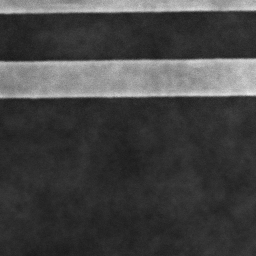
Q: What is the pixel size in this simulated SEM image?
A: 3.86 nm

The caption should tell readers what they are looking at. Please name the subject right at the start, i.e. wiring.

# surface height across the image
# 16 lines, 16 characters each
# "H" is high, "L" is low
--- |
HHHHHHHHHHHHHHHH
LLLLLLLLLLLLLLLL
LLLLLLLLLLLLLLLL
LLLLLLLLLLLLLLLL
HHHHHHHHHHHHHHHH
HHHHHHHHHHHHHHHH
LLLLLLLLLLLLLLLL
LLLLLLLLLLLLLLLL
LLLLLLLLLLLLLLLL
LLLLLLLLLLLLLLLL
LLLLLLLLLLLLLLLL
LLLLLLLLLLLLLLLL
LLLLLLLLLLLLLLLL
LLLLLLLLLLLLLLLL
LLLLLLLLLLLLLLLL
LLLLLLLLLLLLLLLL